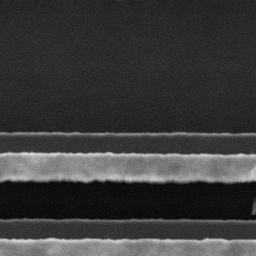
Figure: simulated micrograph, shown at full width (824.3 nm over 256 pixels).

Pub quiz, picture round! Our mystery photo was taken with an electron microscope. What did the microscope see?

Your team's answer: lines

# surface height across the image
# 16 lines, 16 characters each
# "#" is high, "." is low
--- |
................
................
................
................
................
................
................
................
################
################
################
................
................
................
################
################